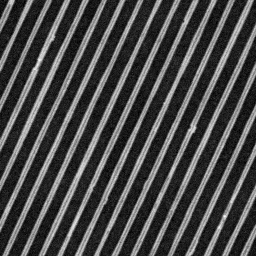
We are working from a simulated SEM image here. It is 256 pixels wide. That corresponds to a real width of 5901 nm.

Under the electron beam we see parallel lines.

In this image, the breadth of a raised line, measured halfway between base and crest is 96.8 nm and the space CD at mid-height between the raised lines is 293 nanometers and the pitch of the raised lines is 0.385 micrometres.